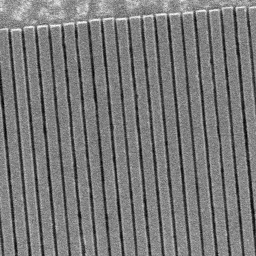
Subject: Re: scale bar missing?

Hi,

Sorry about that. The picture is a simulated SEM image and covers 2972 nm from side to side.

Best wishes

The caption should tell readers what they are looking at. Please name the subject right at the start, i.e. parallel lines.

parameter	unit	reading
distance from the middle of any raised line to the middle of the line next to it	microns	0.154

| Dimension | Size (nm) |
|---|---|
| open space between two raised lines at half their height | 44.8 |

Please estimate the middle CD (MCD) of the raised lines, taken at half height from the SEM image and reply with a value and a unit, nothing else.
114 nm